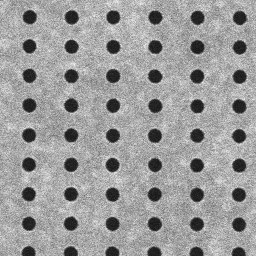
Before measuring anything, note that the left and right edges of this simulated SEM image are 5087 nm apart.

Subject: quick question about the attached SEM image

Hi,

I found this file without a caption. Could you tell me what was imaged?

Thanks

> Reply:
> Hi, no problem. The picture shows a regular array of holes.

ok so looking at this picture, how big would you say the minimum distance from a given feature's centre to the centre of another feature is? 582 nm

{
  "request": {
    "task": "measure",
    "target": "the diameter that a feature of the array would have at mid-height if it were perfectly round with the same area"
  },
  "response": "291 nm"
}